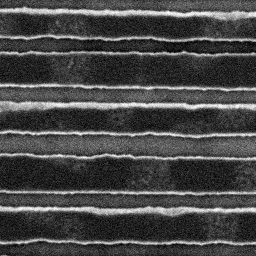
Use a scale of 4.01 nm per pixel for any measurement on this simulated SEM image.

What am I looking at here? lines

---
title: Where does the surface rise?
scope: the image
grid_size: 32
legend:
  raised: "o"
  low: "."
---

................................
ooooooooooo..o..................
oooooooooooooooooooooooooooooooo
oooooooooooooooooooooooooooooooo
oooooooooooooooooooooooooooooooo
................................
..........o.....................
oooooooooooooooooooooooooooooooo
oooooooooooooooooooooooooooooooo
oooooooooooooooooooooooooooooooo
oooooooooooooooooooooooooooooooo
................................
................................
oooooooooooooooooooooooooooooooo
oooooooooooooooooooooooooooooooo
oooooooooooooooooooooooooooooooo
oooooooooooooooooooooooooooooooo
................................
................................
ooooo.oo....oooo................
oooooooooooooooooooooooooooooooo
oooooooooooooooooooooooooooooooo
oooooooooooooooooooooooooooooooo
oooooooooooooooooooooooooooooooo
................................
................................
oooooooooooooooooooooooooooooooo
oooooooooooooooooooooooooooooooo
oooooooooooooooooooooooooooooooo
oooooooooooooooooooooooooooooooo
.............................oo.
................................